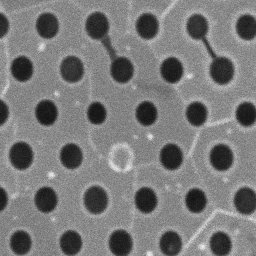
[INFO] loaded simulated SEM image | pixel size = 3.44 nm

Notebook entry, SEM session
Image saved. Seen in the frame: a regular array of holes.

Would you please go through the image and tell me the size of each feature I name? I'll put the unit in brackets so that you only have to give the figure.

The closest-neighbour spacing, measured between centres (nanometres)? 172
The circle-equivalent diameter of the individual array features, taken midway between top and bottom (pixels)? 25.6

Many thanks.